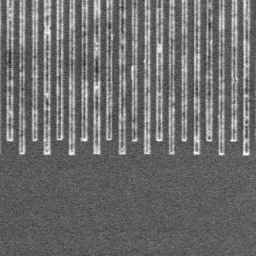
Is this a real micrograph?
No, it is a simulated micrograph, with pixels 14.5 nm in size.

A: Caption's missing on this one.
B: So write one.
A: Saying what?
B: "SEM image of parallel lines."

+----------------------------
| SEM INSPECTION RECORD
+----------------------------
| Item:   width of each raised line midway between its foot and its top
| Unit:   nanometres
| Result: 58.2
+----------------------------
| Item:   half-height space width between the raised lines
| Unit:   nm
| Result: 114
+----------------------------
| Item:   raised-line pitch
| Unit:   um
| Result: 0.181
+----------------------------